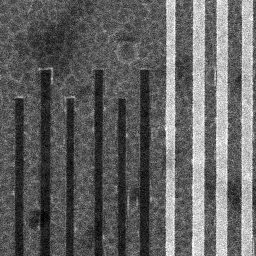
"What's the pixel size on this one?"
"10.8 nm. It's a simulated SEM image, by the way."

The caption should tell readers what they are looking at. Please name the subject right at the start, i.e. parallel lines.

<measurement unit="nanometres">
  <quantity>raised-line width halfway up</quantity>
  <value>110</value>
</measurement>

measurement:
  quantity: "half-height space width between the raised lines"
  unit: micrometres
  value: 0.16